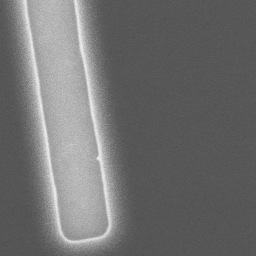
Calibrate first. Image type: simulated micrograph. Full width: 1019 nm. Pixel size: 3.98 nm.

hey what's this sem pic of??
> one or a few lines or trenches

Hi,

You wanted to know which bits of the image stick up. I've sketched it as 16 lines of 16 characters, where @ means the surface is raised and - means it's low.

@@---@@@@@@@@@@@
@@---@@@@@@@@@@@
@@---@@@@@@@@@@@
@@---@@@@@@@@@@@
@@---@@@@@@@@@@@
@@---@@@@@@@@@@@
@@@---@@@@@@@@@@
@@@---@@@@@@@@@@
@@@---@@@@@@@@@@
@@@---@@@@@@@@@@
@@@---@@@@@@@@@@
@@@---@@@@@@@@@@
@@@@---@@@@@@@@@
@@@@---@@@@@@@@@
@@@@---@@@@@@@@@
@@@@@@@@@@@@@@@@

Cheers